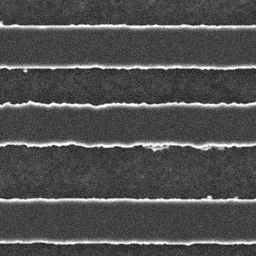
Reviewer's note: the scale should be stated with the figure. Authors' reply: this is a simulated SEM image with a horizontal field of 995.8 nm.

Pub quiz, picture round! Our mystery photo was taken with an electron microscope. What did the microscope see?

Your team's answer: lines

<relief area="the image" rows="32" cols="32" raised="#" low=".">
................................
................................
................................
################################
################################
################################
################################
################################
.#....#.......###.#.#....#####..
................................
................................
................................
................................
################################
################################
################################
################################
################################
................................
................................
................................
................................
................................
................................
................................
################################
################################
################################
################################
################################
.......................#........
................................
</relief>